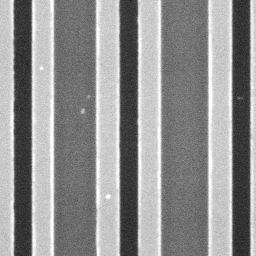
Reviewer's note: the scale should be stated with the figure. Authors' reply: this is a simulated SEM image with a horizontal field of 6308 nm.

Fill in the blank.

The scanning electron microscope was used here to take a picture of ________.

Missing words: lines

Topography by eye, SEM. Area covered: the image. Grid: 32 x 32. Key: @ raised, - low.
@@--@@@-----@@@--@@@------@@@--@
@@--@@@-----@@@--@@@------@@@--@
@@--@@@-----@@@--@@@------@@@--@
@@--@@@-----@@@--@@@------@@@--@
@@--@@@-----@@@--@@@------@@@--@
@@--@@@-----@@@--@@@------@@@--@
@@--@@@-----@@@--@@@------@@@--@
@@--@@@-----@@@--@@@------@@@--@
@@--@@@-----@@@--@@@------@@@--@
@@--@@@-----@@@--@@@------@@@--@
@@--@@@-----@@@--@@@------@@@--@
@@--@@@-----@@@--@@@------@@@--@
@@--@@@-----@@@--@@@------@@@--@
@@--@@@-----@@@--@@@------@@@--@
@@--@@@-----@@@--@@@------@@@--@
@@--@@@-----@@@--@@@------@@@--@
@@--@@@-----@@@--@@@------@@@--@
@@--@@@-----@@@--@@@------@@@--@
@@--@@@-----@@@--@@@------@@@--@
@@--@@@-----@@@--@@@------@@@--@
@@--@@@-----@@@--@@@------@@@--@
@@--@@@-----@@@--@@@------@@@--@
@@--@@@-----@@@--@@@------@@@--@
@@--@@@-----@@@--@@@------@@@--@
@@--@@@-----@@@--@@@------@@@--@
@@--@@@-----@@@--@@@------@@@--@
@@--@@@-----@@@--@@@------@@@--@
@@--@@@-----@@@--@@@------@@@--@
@@--@@@-----@@@--@@@------@@@--@
@@--@@@-----@@@--@@@------@@@--@
@@--@@@-----@@@--@@@------@@@--@
@@--@@@-----@@@--@@@------@@@--@